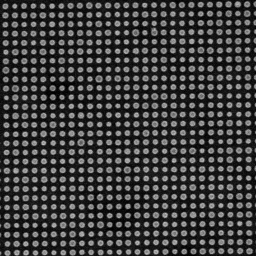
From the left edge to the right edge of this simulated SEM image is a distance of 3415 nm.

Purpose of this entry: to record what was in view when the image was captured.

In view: a regular array of raised bodies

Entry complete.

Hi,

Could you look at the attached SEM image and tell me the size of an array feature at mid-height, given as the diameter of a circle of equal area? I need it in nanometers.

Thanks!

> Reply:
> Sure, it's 69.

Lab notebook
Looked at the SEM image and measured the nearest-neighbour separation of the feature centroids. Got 120 nanometers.